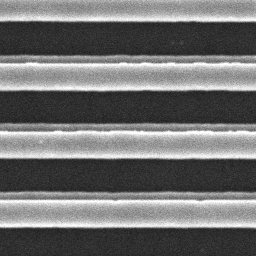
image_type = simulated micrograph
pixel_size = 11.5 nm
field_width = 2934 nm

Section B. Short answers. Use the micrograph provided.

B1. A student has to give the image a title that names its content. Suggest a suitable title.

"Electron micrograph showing lines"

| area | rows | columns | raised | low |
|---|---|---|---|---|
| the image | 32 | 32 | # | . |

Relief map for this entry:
################################
################################
################################
................................
................................
................................
................................
################################
################################
################################
################################
................................
................................
................................
................................
................................
################################
################################
################################
################################
................................
................................
................................
................................
################################
################################
################################
################################
................................
................................
................................
................................